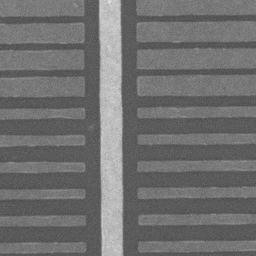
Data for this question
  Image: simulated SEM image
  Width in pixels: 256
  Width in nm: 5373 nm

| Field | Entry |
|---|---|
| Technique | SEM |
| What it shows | groups of lines, slits or small figures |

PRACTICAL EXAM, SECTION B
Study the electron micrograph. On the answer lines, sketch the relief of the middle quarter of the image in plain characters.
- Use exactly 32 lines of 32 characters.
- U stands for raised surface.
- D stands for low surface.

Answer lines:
UUUUUDDDDUUUUUDDDDUUUUUUUUUUUUUU
DDDDDDDDDUUUUUDDDDDDDDDDDDDDDDDD
DDDDDDDDDUUUUUDDDDDDDDDDDDDDDDDD
UUUUUDDDDUUUUUDDDDDUUUUUUUUUUUUU
UUUUUDDDDUUUUUDDDDDUUUUUUUUUUUUU
UUUUUDDDDUUUUUDDDDDUUUUUUUUUUUUU
UUUUUDDDDUUUUUDDDDDUUUUUUUUUUUUU
UUUUUDDDDUUUUUDDDDDUUUUUUUUUUUUU
DDDDDDDDDUUUUUDDDDDDDDDDDDDDDDDD
DDDDDDDDDUUUUUDDDDDDDDDDDDDDDDDD
DDDDDDDDDUUUUUDDDDDDDDDDDDDDDDDD
UUUUUDDDDUUUUUDDDDUUUUUUUUUUUUUU
UUUUUDDDDUUUUUDDDDUUUUUUUUUUUUUU
DDUUUDDDDUUUUUDDDDDDDDDDDDDDDDDD
DDDDDDDDDUUUUUDDDDDDDDDDDDDDDDDD
DDDDDDDDDUUUUUDDDDDDDDDDDDDDDDDD
DDDDDDDDDUUUUUDDDDDDDDDDDDDDDDDD
DDDDDDDDDUUUUUDDDDDDDDDDDDDDDDDD
UUUUUDDDDUUUUUDDDDDUUUUUUUUUUUUU
UUUUUDDDDUUUUUDDDDDUUUUUUUUUUUUU
DDDDDDDDDUUUUUDDDDDDDDDDDDDDDDDD
DDDDDDDDDUUUUUDDDDDDDDDDDDDDDDDD
DDDDDDDDDUUUUUDDDDDDDDDDDDDDDDDD
DDDDDDDDDUUUUUDDDDDDDDDDDDDDDDDD
DDDDDDDDDUUUUUDDDDDUDDDDUUUUUUDD
UUUUUDDDDUUUUUDDDDUUUUUUUUUUUUUU
UUUUUDDDDUUUUUDDDDDUUUUUUUUUUUUU
DDDDDDDDDUUUUUDDDDDDDDDDDDDDDDDD
DDDDDDDDDUUUUUDDDDDDDDDDDDDDDDDD
DDDDDDDDDUUUUUDDDDDDDDDDDDDDDDDD
DDDDDDDDDUUUUUDDDDDDDDDDDDDDDDDD
DDDDDDDDDDUUUUDDDDDUUUUUUUUUUUUU